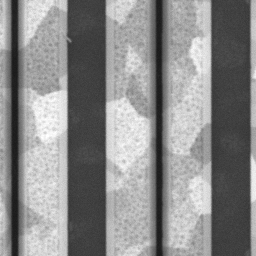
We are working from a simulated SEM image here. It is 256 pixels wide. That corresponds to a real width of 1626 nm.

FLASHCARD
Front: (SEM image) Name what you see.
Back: one or a few lines or trenches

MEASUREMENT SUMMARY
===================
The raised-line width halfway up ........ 40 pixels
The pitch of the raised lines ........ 458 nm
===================